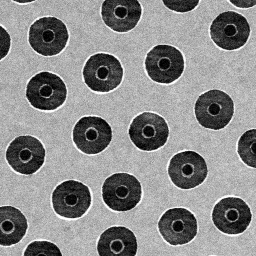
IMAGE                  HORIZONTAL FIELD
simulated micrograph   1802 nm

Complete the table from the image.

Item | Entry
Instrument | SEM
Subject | a regular array of ring-shaped grooves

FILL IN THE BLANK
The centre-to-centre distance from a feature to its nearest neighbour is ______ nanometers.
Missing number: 391